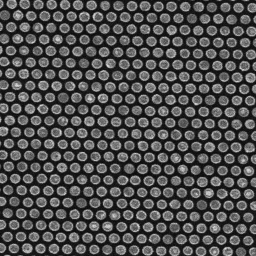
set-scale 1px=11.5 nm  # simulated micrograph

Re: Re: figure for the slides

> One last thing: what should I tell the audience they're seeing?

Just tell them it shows a regular array of raised bodies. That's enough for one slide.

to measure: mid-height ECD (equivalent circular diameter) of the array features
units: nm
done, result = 113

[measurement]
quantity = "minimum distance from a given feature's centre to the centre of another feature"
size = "150 nanometres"